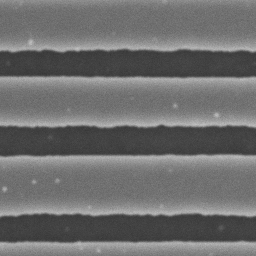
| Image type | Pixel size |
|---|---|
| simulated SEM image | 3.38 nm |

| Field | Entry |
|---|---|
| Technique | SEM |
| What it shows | lines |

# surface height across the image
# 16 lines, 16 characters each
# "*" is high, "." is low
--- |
****************
****************
****************
................
................
****************
****************
****************
................
................
****************
****************
****************
...............*
................
****************